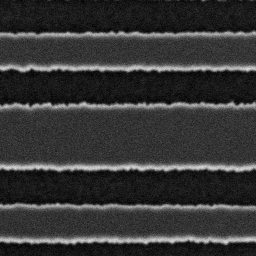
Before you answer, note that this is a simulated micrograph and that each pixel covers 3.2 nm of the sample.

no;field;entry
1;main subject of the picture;lines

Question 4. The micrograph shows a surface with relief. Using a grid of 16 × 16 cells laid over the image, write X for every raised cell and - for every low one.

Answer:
----------------
----------------
XXXXXXXXXXXXXXXX
XXXXXXXXXXXXXXXX
----------------
----------------
-----X-----XX---
XXXXXXXXXXXXXXXX
XXXXXXXXXXXXXXXX
XXXXXXXXXXXXXXXX
XXXXXXXXXXXXXXXX
----------------
----------------
XXXXXXXXXXXXXXXX
XXXXXXXXXXXXXXXX
----------------